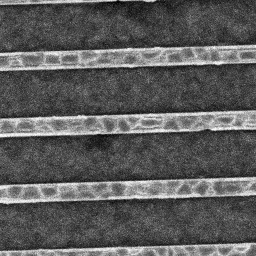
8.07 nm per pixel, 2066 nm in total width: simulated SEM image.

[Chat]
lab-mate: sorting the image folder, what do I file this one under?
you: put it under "one or a few lines or trenches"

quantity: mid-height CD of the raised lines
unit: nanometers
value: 142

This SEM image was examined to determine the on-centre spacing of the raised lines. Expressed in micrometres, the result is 0.534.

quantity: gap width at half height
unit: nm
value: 394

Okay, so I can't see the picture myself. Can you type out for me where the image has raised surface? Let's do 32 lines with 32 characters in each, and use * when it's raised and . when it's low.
*...............................
................................
................................
................................
................................
................................
........************************
********************************
********........................
................................
................................
................................
................................
................................
.........*...*.*****************
********************************
******************..............
................................
................................
................................
................................
................................
.........................*******
********************************
*************************.......
................................
................................
................................
................................
................................
...............................*
********************************